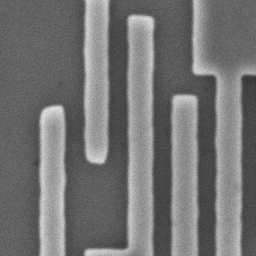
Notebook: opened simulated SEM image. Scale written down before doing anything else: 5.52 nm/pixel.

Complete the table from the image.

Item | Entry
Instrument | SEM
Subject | wiring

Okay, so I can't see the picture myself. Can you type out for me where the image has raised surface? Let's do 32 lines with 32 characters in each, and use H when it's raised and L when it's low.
LLLLLLLLLLLHHHLLLLLLLLLLHHHHHHHH
LLLLLLLLLLLHHLLLLLLLLLLLHHHHHHHH
LLLLLLLLLLLHHHLLHHHLLLLLHHHHHHHH
LLLLLLLLLLLHHLLLHHHLLLLLHHHHHHHH
LLLLLLLLLLLHHLLLHHHLLLLLHHHHHHHH
LLLLLLLLLLLHHLLLHHHLLLLLHHHHHHHH
LLLLLLLLLLLHHLLLHHHLLLLLHHHHHHHH
LLLLLLLLLLLHHLLLHHHLLLLLHHHHHHHH
LLLLLLLLLLLHHLLLHHHLLLLLHHHHHHHH
LLLLLLLLLLLHHLLLHHHLLLLLLLLHHHLL
LLLLLLLLLLLHHHLLHHHLLLLLLLLHHHLL
LLLLLLLLLLLHHHLLHHHLLLLLLLLHHHLL
LLLLLLLLLLLHHLLLHHHLLLHHHLLHHHLL
LLLLLLHHLLLHHLLLHHHLLLHHHLLHHHLL
LLLLLHHHLLLHHLLLHHHLLLHHHLLHHHLL
LLLLLHHHLLLHHLLLHHHLLLHHHLLHHHLL
LLLLLHHHLLLHHLLLHHHLLLHHHLLHHHLL
LLLLLHHHLLLHHLLLHHHLLLHHHLLHHHLL
LLLLLHHHLLLHHLLLHHHLLLHHHLLHHHLL
LLLLLHHHLLLHHLLLHHHLLLHHHLLHHHLL
LLLLLHHHLLLLLLLLHHHLLLHHHLLHHHLL
LLLLLHHHLLLLLLLLHHHLLLHHHLLHHHLL
LLLLLHHHLLLLLLLLHHHLLLHHHLLHHHLL
LLLLLHHHLLLLLLLLHHHLLLHHHLLHHHLL
LLLLLHHHLLLLLLLLHHHLLLHHHLLHHHLL
LLLLLHHHLLLLLLLLHHHLLLHHHLLHHHLL
LLLLLHHHLLLLLLLLHHHLLLHHHLLHHHLL
LLLLLHHHLLLLLLLLHHHLLLHHHLLHHHLL
LLLLLHHHLLLLLLLLHHHLLLHHHLLHHHLL
LLLLLHHHLLLLLLLLHHHLLLHHHLLHHHLL
LLLLLHHHLLLLLLLLHHHLLLHHHLLHHHLL
LLLLLHHHLLLHHHHHHHHLLLHHHLLHHHLL